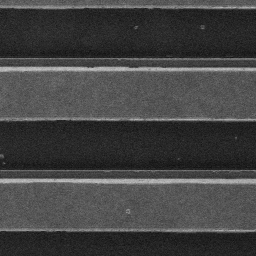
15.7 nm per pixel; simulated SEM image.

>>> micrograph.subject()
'lines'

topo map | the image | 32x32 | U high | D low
UUUUUUUUUUUUUUUUUUUUUUUUUUUUUUUU
DDDDDDDDDDDDDDDDDDDDDDDDDDDDDDDD
DDDDDDDDDDDDDDDDDDDDDDDDDDDDDDDD
DDDDDDDDDDDDDDDDDDDDDDDDDDDDDDDD
DDDDDDDDDDDDDDDDDDDDDDDDDDDDDDDD
DDDDDDDDDDDDDDDDDDDDDDDDDDDDDDDD
DDDDDDDDDDDDDDDDDDDDDDDDDDDDDDDD
UUUUUUUUUUUUUUUUUUUUUUUUUUUUUUUU
UUUUUUUUUUUUUUUUUUUUUUUUUUUUUUUU
UUUUUUUUUUUUUUUUUUUUUUUUUUUUUUUU
UUUUUUUUUUUUUUUUUUUUUUUUUUUUUUUU
UUUUUUUUUUUUUUUUUUUUUUUUUUUUUUUU
UUUUUUUUUUUUUUUUUUUUUUUUUUUUUUUU
UUUUUUUUUUUUUUUUUUUUUUUUUUUUUUUU
UUUUUUUUUUUUUUUUUUUUUUUUUUUUUUUU
DDDDDDDDDDDDDDDDDDDDDDDDDDDDDDDD
DDDDDDDDDDDDDDDDDDDDDDDDDDDDDDDD
DDDDDDDDDDDDDDDDDDDDDDDDDDDDDDDD
DDDDDDDDDDDDDDDDDDDDDDDDDDDDDDDD
DDDDDDDDDDDDDDDDDDDDDDDDDDDDDDDD
DDDDDDDDDDDDDDDDDDDDDDDDDDDDDDDD
UUUUUUUUUUUUUUUUUUUUUUUUUUUUUUUU
UUUUUUUUUUUUUUUUUUUUUUUUUUUUUUUU
UUUUUUUUUUUUUUUUUUUUUUUUUUUUUUUU
UUUUUUUUUUUUUUUUUUUUUUUUUUUUUUUU
UUUUUUUUUUUUUUUUUUUUUUUUUUUUUUUU
UUUUUUUUUUUUUUUUUUUUUUUUUUUUUUUU
UUUUUUUUUUUUUUUUUUUUUUUUUUUUUUUU
UUUUUUUUUUUUUUUUUUUUUUUUUUUUUUUU
DDDDDDDDDDDDDDDDDDDDDDDDDDDDDDDD
DDDDDDDDDDDDDDDDDDDDDDDDDDDDDDDD
DDDDDDDDDDDDDDDDDDDDDDDDDDDDDDDD